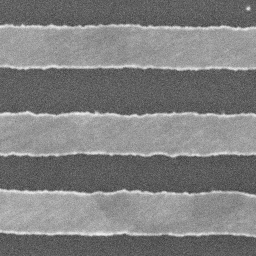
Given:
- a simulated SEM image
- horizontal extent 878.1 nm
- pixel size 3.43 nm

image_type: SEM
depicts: lines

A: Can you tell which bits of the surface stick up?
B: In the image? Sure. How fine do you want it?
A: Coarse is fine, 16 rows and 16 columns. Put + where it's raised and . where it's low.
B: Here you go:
................
................
++++++++++++++++
++++++++++++++++
................
................
................
++++++++++++++++
++++++++++++++++
++++++++++++++++
................
................
++++++++++++++++
++++++++++++++++
++++++++++++++++
................